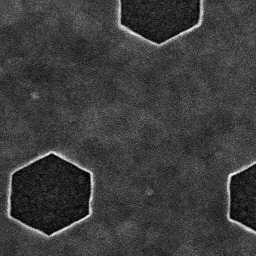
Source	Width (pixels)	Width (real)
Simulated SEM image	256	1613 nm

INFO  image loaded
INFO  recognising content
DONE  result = holes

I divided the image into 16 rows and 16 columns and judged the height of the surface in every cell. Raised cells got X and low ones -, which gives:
XXXXXXXX-----XXX
XXXXXXXX----XXXX
XXXXXXXXX-XXXXXX
XXXXXXXXXXXXXXXX
XXXXXXXXXXXXXXXX
XXXXXXXXXXXXXXXX
XXXXXXXXXXXXXXXX
XXXXXXXXXXXXXXXX
XXXXXXXXXXXXXXXX
XXXXXXXXXXXXXXXX
X----XXXXXXXXXXX
X-----XXXXXXXX--
X-----XXXXXXXX--
X----XXXXXXXXXX-
XXXXXXXXXXXXXXXX
XXXXXXXXXXXXXXXX